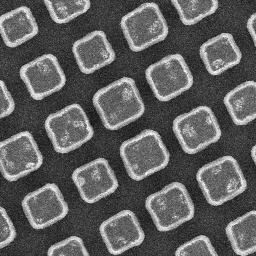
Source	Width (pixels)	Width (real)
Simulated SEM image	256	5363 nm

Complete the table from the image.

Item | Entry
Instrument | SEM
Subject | a regular array of raised bodies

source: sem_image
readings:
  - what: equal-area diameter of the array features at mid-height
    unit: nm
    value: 867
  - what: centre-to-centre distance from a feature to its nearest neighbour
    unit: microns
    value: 1.17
